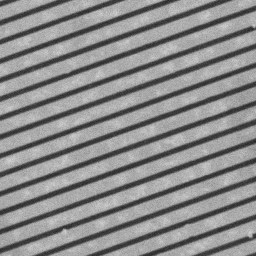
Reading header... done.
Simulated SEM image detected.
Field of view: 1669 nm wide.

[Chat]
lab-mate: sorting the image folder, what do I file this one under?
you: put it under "parallel lines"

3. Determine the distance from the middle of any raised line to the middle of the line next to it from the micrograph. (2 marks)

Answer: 116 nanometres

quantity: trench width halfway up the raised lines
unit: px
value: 5.87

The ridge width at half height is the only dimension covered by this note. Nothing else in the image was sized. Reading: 82.9 nanometers